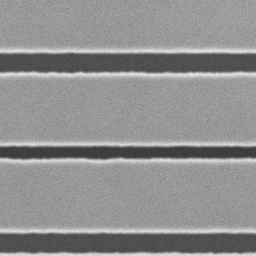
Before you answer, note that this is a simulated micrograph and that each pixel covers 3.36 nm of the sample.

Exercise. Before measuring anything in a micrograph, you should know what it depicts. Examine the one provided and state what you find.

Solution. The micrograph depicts lines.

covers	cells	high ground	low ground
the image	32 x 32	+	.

++++++++++++++++++++++++++++++++
++++++++++++++++++++++++++++++++
++++++++++++++++++++++++++++++++
++++++++++++++++++++++++++++++++
++++++++++++++++++++++++++++++++
++++++++++++++++++++++++++++++++
++++++++++++++++++++++++++++++++
................................
................................
++++++++++++++++++++++++++++++++
++++++++++++++++++++++++++++++++
++++++++++++++++++++++++++++++++
++++++++++++++++++++++++++++++++
++++++++++++++++++++++++++++++++
++++++++++++++++++++++++++++++++
++++++++++++++++++++++++++++++++
++++++++++++++++++++++++++++++++
++++++++++++++++++++++++++++++++
................................
................................
++++++++++++++++++++++++++++++++
++++++++++++++++++++++++++++++++
++++++++++++++++++++++++++++++++
++++++++++++++++++++++++++++++++
++++++++++++++++++++++++++++++++
++++++++++++++++++++++++++++++++
++++++++++++++++++++++++++++++++
++++++++++++++++++++++++++++++++
++++++++++++++++++++++++++++++++
................................
................................
................................